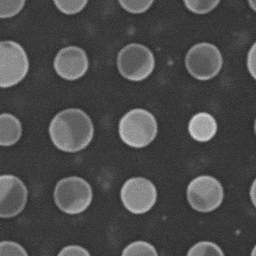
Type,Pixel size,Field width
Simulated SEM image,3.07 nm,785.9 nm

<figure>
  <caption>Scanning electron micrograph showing a regular array of raised bodies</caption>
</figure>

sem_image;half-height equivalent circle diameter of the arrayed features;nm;111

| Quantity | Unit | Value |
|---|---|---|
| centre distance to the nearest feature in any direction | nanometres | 199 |